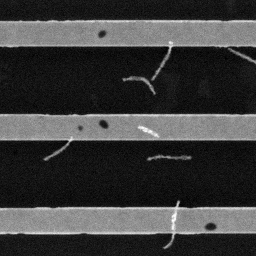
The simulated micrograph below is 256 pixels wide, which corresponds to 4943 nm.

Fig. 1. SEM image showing lines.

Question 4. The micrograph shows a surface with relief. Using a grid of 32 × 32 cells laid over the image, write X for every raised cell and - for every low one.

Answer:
--------------------------------
--------------------------------
--------------------------------
XXXXXXXXXXXXXXXXXXXXXXXXXXXXXXXX
XXXXXXXXXXXXXXXXXXXXXXXXXXXXXXXX
XXXXXXXXXXXXXXXXXXXXXXXXXXXXXXXX
--------------------------------
--------------------------------
--------------------------------
--------------------------------
--------------------------------
--------------------------------
--------------------------------
--------------------------------
XXXXXXXXXXXXXXXXXXXXXXXXXXXXXXXX
XXXXXXXXXXXXXXXXXXXXXXXXXXXXXXXX
XXXXXXXXXXXXXXXXXXXXXXXXXXXXXXXX
--------X-----------------------
--------------------------------
--------------------------------
--------------------------------
--------------------------------
--------------------------------
--------------------------------
--------------------------------
--------------------------------
XXXXXXXXXXXXXXXXXXXXXXXXXXXXXXXX
XXXXXXXXXXXXXXXXXXXXXXXXXXXXXXXX
XXXXXXXXXXXXXXXXXXXXXXXXXXXXXXXX
--------------------------------
--------------------------------
--------------------------------